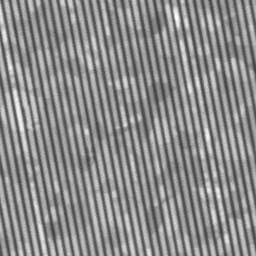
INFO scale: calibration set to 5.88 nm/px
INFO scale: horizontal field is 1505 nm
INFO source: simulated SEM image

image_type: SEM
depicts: parallel lines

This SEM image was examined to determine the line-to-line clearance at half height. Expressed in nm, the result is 20.2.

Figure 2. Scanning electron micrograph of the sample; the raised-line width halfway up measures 25.3 nanometres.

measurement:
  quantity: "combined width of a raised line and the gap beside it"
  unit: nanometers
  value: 46.3